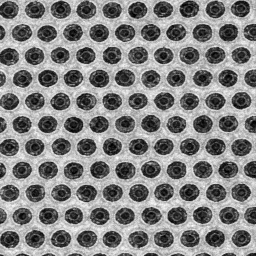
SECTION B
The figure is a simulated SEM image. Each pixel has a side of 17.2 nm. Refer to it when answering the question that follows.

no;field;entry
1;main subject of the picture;a regular array of ring-shaped grooves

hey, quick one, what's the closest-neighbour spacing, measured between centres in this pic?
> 437 nanometers